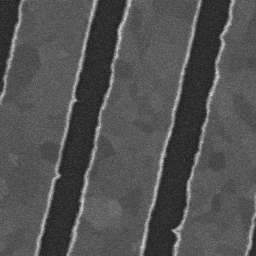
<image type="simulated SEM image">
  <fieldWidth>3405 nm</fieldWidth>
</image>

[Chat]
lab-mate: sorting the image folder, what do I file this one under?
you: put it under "one or a few lines or trenches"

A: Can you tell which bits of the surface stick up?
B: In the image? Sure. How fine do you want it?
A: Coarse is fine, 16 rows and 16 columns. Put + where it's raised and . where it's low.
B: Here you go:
.+++++..++++..++
.+++++..++++..++
.++++..+++++..++
.++++..+++++..++
+++++..++++...++
+++++..++++..+++
++++...++++..+++
++++..+++++..+++
++++..+++++..+++
++++..++++..++++
++++..++++..++++
+++..+++++..++++
+++..+++++..++++
+++..++++...++++
+++..++++..+++++
++..+++++..+++++